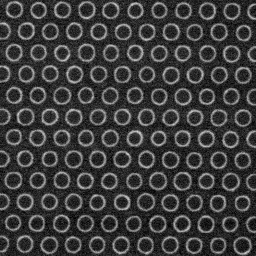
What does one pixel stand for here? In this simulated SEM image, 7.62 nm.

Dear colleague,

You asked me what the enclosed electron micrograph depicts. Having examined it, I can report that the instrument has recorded a regular array of raised bodies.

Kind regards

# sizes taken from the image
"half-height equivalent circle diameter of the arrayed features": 0.119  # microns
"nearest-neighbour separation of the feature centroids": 182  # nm